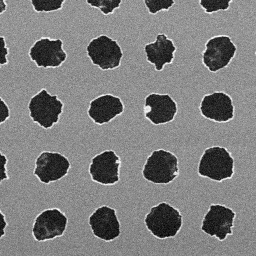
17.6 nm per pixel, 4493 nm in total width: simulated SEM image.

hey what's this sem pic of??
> a regular array of holes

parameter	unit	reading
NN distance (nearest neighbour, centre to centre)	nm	971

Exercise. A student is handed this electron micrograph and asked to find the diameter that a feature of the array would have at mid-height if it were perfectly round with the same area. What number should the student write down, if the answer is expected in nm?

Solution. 570